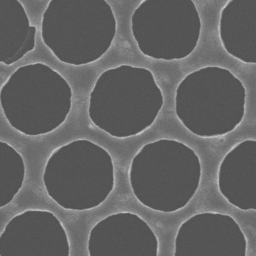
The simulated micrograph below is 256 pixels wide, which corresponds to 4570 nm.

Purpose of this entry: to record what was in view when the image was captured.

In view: holes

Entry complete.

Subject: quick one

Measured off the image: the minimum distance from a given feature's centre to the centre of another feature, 1510 nm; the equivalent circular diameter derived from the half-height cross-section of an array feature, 1260 nanometres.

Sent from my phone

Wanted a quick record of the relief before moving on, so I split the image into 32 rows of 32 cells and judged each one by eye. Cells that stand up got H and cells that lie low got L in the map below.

LLLHHHLLLLLLLHHHHHLLLLLLHHHHLLLL
LLLHHHLLLLLLLLHHHLLLLLLLLHHHLLLL
LLLLHLLLLLLLLLHHLLLLLLLLLHHHLLLL
LLLLHLLLLLLLLLLHHLLLLLLLLHHLLLLL
LLLLHLLLLLLLLLHHHLLLLLLLLHHHLLLL
LLLLHHLLLLLLLLHHHLLLLLLLLHHHLLLL
LLLLHHHLLLLLLHHHHHLLLLLLHHHHLLLL
LLHHHHHHLLLLHHHHHHHHHHHHHHHHHHLL
HHLLLLHHHHHHHHLLLLHHHHHHHHLHHHHH
HLLLLLLLHHHHLLLLLLLHHHHLLLLLLHHH
HLLLLLLLHHHHLLLLLLLLHHHLLLLLLLHH
LLLLLLLLLHHLLLLLLLLLHHLLLLLLLLLH
LLLLLLLLLHHLLLLLLLLLHHLLLLLLLLLH
LLLLLLLLLHHLLLLLLLLLHHLLLLLLLLLH
HLLLLLLLHHHLLLLLLLLLHHLLLLLLLLHH
HLLLLLLLHHHHLLLLLLLHHHHLLLLLLLHH
HHHLLLHHHHHHHLLLLHHHHHHHLLLLLHHH
HHHHHHHHHHHHHHHHHHHHLHHHHHHHHHHH
LLHHHHHLLLLLLHHHHHLLLLLLHHHHHLLL
LLLHHHLLLLLLLLHHHLLLLLLLLHHHLLLL
LLLHHHLLLLLLLLHHLLLLLLLLLHHHLLLL
LLLHHHLLLLLLLLHHLLLLLLLLLHHLLLLL
LLLHHLLLLLLLLLHHLLLLLLLLLHHLLLLL
LLLHHHLLLLLLLLHHLLLLLLLLLHHLLLLL
LLHHHHLLLLLLLHHHHLLLLLLLHHHHLLLL
LHHHHHHLLLLLHHHHHHLLLLLHHHHHHLLL
HHHLLLHHHHHHHHHHHHHHHHHHHHHHHHHH
HLLLLLLHHHHHHLLLLLHHHHHHLLLLLHHH
HLLLLLLLHHHHLLLLLLLHHHLLLLLLLLHH
LLLLLLLLHHHLLLLLLLLHHHLLLLLLLLHH
LLLLLLLLLHHLLLLLLLLLHHLLLLLLLLLH
LLLLLLLLLHHLLLLLLLLLHHLLLLLLLLLH